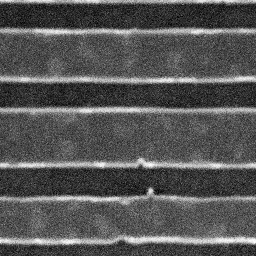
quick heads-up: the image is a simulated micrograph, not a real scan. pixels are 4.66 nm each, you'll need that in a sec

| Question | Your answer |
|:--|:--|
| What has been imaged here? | one or a few lines or trenches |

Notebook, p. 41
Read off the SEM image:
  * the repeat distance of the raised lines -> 382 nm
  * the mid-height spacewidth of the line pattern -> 0.132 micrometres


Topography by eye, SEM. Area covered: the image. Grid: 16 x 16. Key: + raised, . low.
................
................
++++++++++++++++
++++++++++++++++
++++++++++++++++
................
................
++++++++++++++++
++++++++++++++++
++++++++++++++++
................
................
++++++++++++++++
++++++++++++++++
++++++++++++++++
................